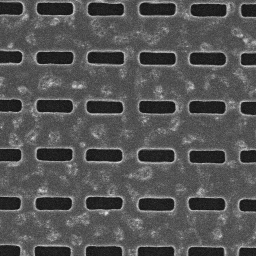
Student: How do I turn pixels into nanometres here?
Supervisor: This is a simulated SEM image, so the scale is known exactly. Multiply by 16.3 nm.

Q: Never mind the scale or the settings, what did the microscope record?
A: a regular array of holes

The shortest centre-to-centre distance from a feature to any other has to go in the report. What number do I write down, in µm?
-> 0.788